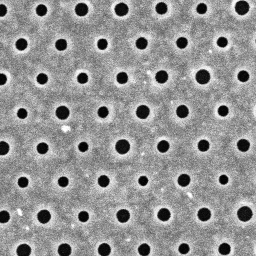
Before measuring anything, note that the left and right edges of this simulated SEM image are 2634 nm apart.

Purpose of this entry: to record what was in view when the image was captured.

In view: a regular array of holes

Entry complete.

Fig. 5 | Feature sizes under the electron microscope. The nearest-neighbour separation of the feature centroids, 406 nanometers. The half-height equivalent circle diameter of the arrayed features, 126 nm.